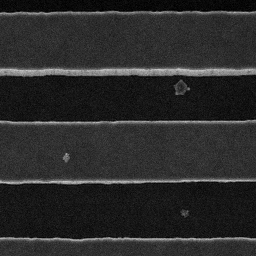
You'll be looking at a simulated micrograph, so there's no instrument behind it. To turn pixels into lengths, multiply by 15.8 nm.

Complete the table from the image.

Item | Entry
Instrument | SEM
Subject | lines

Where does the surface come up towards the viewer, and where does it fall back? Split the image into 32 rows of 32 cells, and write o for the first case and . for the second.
................................
................................
oooooooooooooooooooooooooooooooo
oooooooooooooooooooooooooooooooo
oooooooooooooooooooooooooooooooo
oooooooooooooooooooooooooooooooo
oooooooooooooooooooooooooooooooo
oooooooooooooooooooooooooooooooo
oooooooooooooooooooooooooooooooo
................................
................................
................................
................................
................................
................................
oooooooooooooooooooooooooooooooo
oooooooooooooooooooooooooooooooo
oooooooooooooooooooooooooooooooo
oooooooooooooooooooooooooooooooo
oooooooooooooooooooooooooooooooo
oooooooooooooooooooooooooooooooo
oooooooooooooooooooooooooooooooo
oooooooooooooooooooooooooooooooo
................................
................................
................................
................................
................................
................................
................................
oooooooooooooooooooooooooooooooo
oooooooooooooooooooooooooooooooo